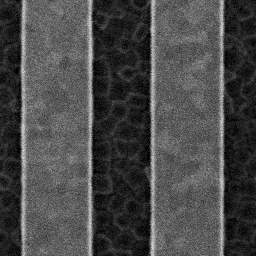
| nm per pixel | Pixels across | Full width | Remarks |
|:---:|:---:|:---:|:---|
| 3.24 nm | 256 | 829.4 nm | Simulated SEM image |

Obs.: one or a few lines or trenches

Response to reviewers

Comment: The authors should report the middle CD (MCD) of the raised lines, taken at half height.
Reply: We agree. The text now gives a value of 226 nanometers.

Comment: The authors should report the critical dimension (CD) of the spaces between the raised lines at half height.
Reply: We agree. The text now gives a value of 0.199 micrometres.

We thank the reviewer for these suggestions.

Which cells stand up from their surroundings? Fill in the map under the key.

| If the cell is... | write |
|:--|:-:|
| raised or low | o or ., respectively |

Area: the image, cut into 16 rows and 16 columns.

.ooooo....oooo..
.ooooo...ooooo..
.ooooo....oooo..
.ooooo....oooo..
.ooooo....oooo..
.ooooo....oooo..
.ooooo....oooo..
.ooooo....oooo..
.ooooo....oooo..
.ooooo....oooo..
.ooooo....oooo..
.ooooo....oooo..
.ooooo....oooo..
.ooooo....oooo..
.ooooo....oooo..
.ooooo....oooo..